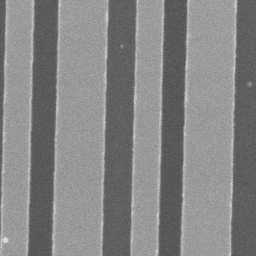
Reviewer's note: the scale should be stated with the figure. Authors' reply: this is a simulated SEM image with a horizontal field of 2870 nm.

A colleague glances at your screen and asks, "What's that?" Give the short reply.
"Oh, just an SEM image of lines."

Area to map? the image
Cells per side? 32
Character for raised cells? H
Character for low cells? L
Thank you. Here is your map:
LHHHLLLHHHHHHLLLLHHHLLLLHHHHHHLL
LHHHLLLHHHHHHLLLLHHHLLLLHHHHHLLL
LHHHLLLHHHHHHLLLLHHHLLLLHHHHHLLL
LHHHLLLHHHHHHLLLLHHHLLLLHHHHHLLL
LHHHLLLHHHHHHLLLLHHHLLLHHHHHHLLL
LHHHLLLHHHHHHLLLLHHHLLLHHHHHHLLL
LHHHLLLHHHHHHLLLLHHHLLLHHHHHHLLL
LHHHLLLHHHHHHLLLLHHHLLLHHHHHHLLL
LHHHLLLHHHHHHLLLLHHHLLLHHHHHHLLL
LHHHLLLHHHHHHLLLLHHHLLLHHHHHHLLL
LHHHLLLHHHHHHLLLLHHHLLLHHHHHHLLL
LHHHLLLHHHHHHLLLLHHHLLLHHHHHHLLL
LHHHLLLHHHHHHLLLLHHHLLLHHHHHHLLL
LHHHLLLHHHHHHLLLLHHHLLLHHHHHHLLL
LHHHLLLHHHHHHLLLLHHHLLLHHHHHHLLL
LHHHLLLHHHHHHLLLLHHHLLLHHHHHHLLL
HHHHLLLHHHHHHLLLLHHHLLLHHHHHHLLL
HHHHLLLHHHHHHLLLLHHHLLLHHHHHHLLL
HHHHLLLHHHHHHLLLLHHHLLLHHHHHHLLL
HHHHLLLHHHHHHLLLLHHHLLLHHHHHHLLL
HHHHLLLHHHHHHLLLLHHHLLLHHHHHHLLL
HHHHLLLHHHHHHLLLLHHHLLLHHHHHHLLL
HHHHLLLHHHHHHLLLLHHHLLLHHHHHHLLL
HHHHLLLHHHHHHLLLLHHHLLLHHHHHHLLL
HHHHLLLHHHHHHLLLLHHHLLLHHHHHHLLL
HHHHLLLHHHHHHLLLLHHHLLLHHHHHHLLL
HHHLLLLHHHHHHLLLLHHHLLLHHHHHHLLL
HHHLLLLHHHHHHLLLLHHHLLLHHHHHHLLL
HHHLLLLHHHHHHLLLLHHHLLLHHHHHHLLL
HHHLLLLHHHHHHLLLHHHHLLLHHHHHHLLL
HHHLLLLHHHHHHLLLHHHHLLLHHHHHHLLL
HHHLLLLHHHHHHLLLHHHHLLLHHHHHHLLL